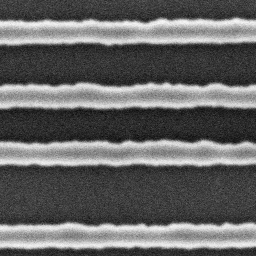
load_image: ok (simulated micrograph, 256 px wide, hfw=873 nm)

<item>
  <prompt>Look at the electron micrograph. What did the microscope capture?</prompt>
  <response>lines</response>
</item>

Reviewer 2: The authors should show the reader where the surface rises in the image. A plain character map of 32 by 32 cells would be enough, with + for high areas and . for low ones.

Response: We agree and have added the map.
................................
................................
.............................+..
++++++++++++++++++++++++++++++++
++++++++++++++++++++++++++++++++
................................
................................
................................
................................
................................
................................
++++++++++++++++++++++++++++++++
++++++++++++++++++++++++++++++++
................................
................................
................................
................................
................................
++++++++++++++++++++++++++++++++
++++++++++++++++++++++++++++++++
.....++.++....++...+..+.++......
................................
................................
................................
................................
................................
................................
................................
++++++++++++++++++++++++++++++++
++++++++++++++++++++++++++++++++
++++++++++++++++++++++++++++++++
................................